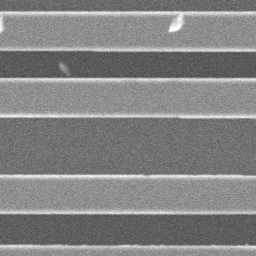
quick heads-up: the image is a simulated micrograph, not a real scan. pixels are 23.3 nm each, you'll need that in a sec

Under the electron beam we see lines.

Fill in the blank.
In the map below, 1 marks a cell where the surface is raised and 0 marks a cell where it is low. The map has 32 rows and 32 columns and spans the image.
00000000000000000000000000000000
00000000000000000000000000000000
11111111111111111111111111111111
11111111111111111111111111111111
11111111111111111111111111111111
11111111111111111111111111111111
00000000000000000000000000000000
00000000000000000000000000000000
00000000000000000000000000000000
00000000000000000000000000000000
11111111111111111111111111111111
11111111111111111111111111111111
11111111111111111111111111111111
11111111111111111111111111111111
11111111111111111111111111111111
00000000000000000000000000000000
00000000000000000000000000000000
00000000000000000000000000000000
00000000000000000000000000000000
00000000000000000000000000000000
00000000000000000000000000000000
00000000000000000000000000000000
11111111111111111111111111111111
11111111111111111111111111111111
11111111111111111111111111111111
11111111111111111111111111111111
11111111111111111111111111111111
00000000000000000000000000000000
00000000000000000000000000000000
00000000000000000000000000000000
00000000000000000000000000000000
11111111111111111111111111111111